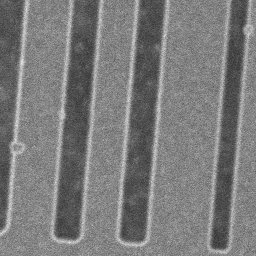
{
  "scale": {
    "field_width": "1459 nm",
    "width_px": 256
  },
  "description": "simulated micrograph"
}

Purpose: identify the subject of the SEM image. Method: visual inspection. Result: one or a few lines or trenches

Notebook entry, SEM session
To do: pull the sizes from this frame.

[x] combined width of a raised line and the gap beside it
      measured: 424 nanometers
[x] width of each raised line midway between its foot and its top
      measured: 254 nm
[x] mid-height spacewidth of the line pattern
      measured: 170 nm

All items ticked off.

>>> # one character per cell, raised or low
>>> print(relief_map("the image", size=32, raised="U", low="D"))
DDDUUUUUUDDDDUUUUDDDDUUUUUUUUDDU
DDDUUUUUUDDDDUUUUDDDDUUUUUUUUDDU
DDDUUUUUUDDDDUUUUDDDDUUUUUUUDDDU
DDDUUUUUUDDDUUUUUDDDDUUUUUUUDDDU
DDDUUUUUUDDDUUUUUDDDDUUUUUUUDDDU
DDDUUUUUDDDDUUUUUDDDUUUUUUUUDDDU
DDDUUUUUDDDDUUUUUDDDUUUUUUUUDDDU
DDDUUUUUDDDDUUUUUDDDUUUUUUUUDDDU
DDDUUUUUDDDDUUUUDDDDUUUUUUUUDDDU
DDDUUUUUDDDDUUUUDDDDUUUUUUUUDDDU
DDDUUUUUDDDDUUUUDDDDUUUUUUUUDDUU
DDUUUUUUDDDDUUUUDDDDUUUUUUUUDDUU
DDUUUUUUDDDDUUUUDDDDUUUUUUUUDDUU
DDUUUUUUDDDDUUUUDDDDUUUUUUUUDDUU
DDUUUUUUDDDDUUUUDDDDUUUUUUUDDDUU
DDUUUUUUDDDUUUUUDDDDUUUUUUUDDDUU
DDUUUUUUDDDUUUUUDDDDUUUUUUUDDDUU
DDUUUUUDDDDUUUUUDDDDUUUUUUUDDDUU
DUUUUUUDDDDUUUUUDDDUUUUUUUUDDDUU
DDUUUUUDDDDUUUUUDDDUUUUUUUUDDDUU
DDUUUUUDDDDUUUUDDDDUUUUUUUUDDDUU
DDUUUUUDDDDUUUUDDDDUUUUUUUUDDUUU
DUUUUUUDDDDUUUUDDDDUUUUUUUUDDUUU
DUUUUUUDDDDUUUUDDDDUUUUUUUUDDUUU
DUUUUUUDDDDUUUUDDDDUUUUUUUUDDUUU
DUUUUUUDDDDUUUUDDDDUUUUUUUUDDUUU
DUUUUUUDDDUUUUUDDDDUUUUUUUDDDUUU
DUUUUUUDDDUUUUUDDDDUUUUUUUDDDUUU
DUUUUUUDDDUUUUUDDDDUUUUUUUDDDUUU
UUUUUUUDDDUUUUUDDDUUUUUUUUDDDUUU
UUUUUUUUUUUUUUUUDDUUUUUUUUDDDUUU
UUUUUUUUUUUUUUUUUUUUUUUUUUUUUUUU